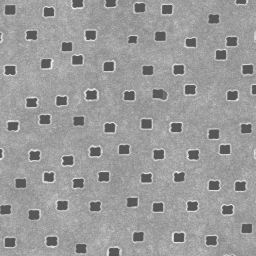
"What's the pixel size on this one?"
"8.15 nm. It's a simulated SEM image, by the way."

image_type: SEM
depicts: a regular array of holes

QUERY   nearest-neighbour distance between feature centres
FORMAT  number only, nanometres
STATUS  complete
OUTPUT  219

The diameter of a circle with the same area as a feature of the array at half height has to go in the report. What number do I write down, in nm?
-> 86.8